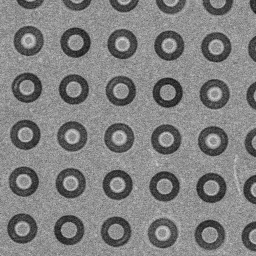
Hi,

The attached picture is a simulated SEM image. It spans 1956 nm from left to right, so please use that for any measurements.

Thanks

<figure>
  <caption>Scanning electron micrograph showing an array of small figures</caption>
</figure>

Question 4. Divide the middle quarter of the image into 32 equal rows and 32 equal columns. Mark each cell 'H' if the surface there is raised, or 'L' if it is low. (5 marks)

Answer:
HHHHHHHHHHHHHHHHHHHHHHHHHHHHHHHH
HHHHHHHHHHHHHHHHHHHHHHHHHHHHHHHH
HHLHHHHHHHHHHHHHHHHHHHHHHHHHHHHH
LLLLLHHHHHHHLLLLLHHHHHHHHLLHHHHH
LLLLLLHHHHHLLLLLLLHHHHHLLLLLLHHH
LHHHLLHHHHLLLHHHLLHHHHLLLHHLLHHH
LHHHLLHHHHLLLHHHLLHHHHLLHHHHLLHH
LHHHLLHHHHLLLHHHLLHHHHLLHHHHLLHH
LLLLLLHHHHHLLLHLLLHHHHLLLHHLLHHH
LLLLLHHHHHHLLLLLLHHHHHHLLLLLLHHH
HHHHHHHHHHHHHLLHHHHHHHHHLLLLHHHH
HHHHHHHHHHHHHHHHHHHHHHHHHHHHHHHH
HHHHHHHHHHHHHHHHHHHHHHHHHHHHHHHH
HHHHHHHHHHHHHHHHHHHHHHHHHHHHHHHH
HLLLHHHHHHHHHHHHHHHHHHHHHHHHHHHH
LLLLLHHHHHHLLLLLHHHHHHHLLLLLHHHH
LLLLLLHHHHLLLLLLLHHHHHLLLLLLLHHH
LHHHLLHHHHLLLHHLLLHHHHLLLHHLLLHH
LHHHLLHHHHLLHHHLLLHHHHLLHHHLLLHH
LHHLLLHHHHLLLHHLLLHHHLLLHHHLLHHH
LLLLLHHHHHLLLLLLLHHHHHLLLLLLLHHH
LLLLHHHHHHHLLLLLHHHHHHHLLLLLHHHH
HHHHHHHHHHHHHHHHHHHHHHHHLLLHHHHH
HHHHHHHHHHHHHHHHHHHHHHHHHHHHHHHH
HHHHHHHHHHHHHHHHHHHHHHHHHHHHHHHH
HHHHHHHHHHHHHHHHHHHHHHHHHHHHHHHH
LLLLHHHHHHHHHLHHHHHHHHHHHHHHHHHH
LLLLLHHHHHHLLLLLHHHHHHHLLLLHHHHH
LHHLLHHHHHLLLHLLLHHHHHLLLLLLHHHH
HHHLLLHHHHLLHHHLLHHHHLLLHHHLLHHH
HHHLLLHHHLLLHHHLLHHHHLLHHHHLLHHH
LLLLLHHHHHLLHHLLLHHHHLLHHHHLLHHH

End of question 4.